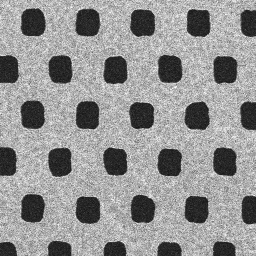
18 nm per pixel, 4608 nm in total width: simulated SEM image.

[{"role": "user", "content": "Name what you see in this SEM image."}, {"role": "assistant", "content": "a regular array of holes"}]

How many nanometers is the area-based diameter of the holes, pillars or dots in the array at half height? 494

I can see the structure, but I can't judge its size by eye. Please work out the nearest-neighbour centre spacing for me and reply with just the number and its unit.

961 nm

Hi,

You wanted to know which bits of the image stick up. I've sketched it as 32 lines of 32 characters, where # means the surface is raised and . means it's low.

################################
###..#####..#####..####...####..
###...###...####...####...####..
###...###...####...####...####..
####.#####..#####..#####..#####.
################################
################################
..####...####...####...####..###
..####...####...####...####...##
..####...####...####...####...##
################################
################################
################################
###...####..####...####...####..
###...####..####...####...####..
###..#####..####...####...####..
################################
################################
.##########################.####
..####...####...####...####...##
..####...####...####...####...##
..####...####...####...####...##
################################
################################
###..############.######.#######
###...####..####...####...####..
###..####....###...####...####..
###..#####..#####..####...####..
################################
################################
..####...####..#####..#####..###
..####...####...####...####..###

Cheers